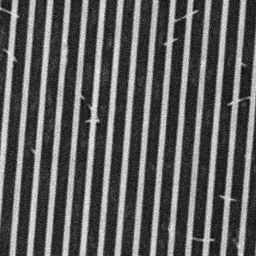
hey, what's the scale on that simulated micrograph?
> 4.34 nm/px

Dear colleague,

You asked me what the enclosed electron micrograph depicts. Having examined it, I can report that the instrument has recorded parallel lines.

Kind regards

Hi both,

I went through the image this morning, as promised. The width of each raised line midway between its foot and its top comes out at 4.61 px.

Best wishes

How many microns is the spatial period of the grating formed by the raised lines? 0.0759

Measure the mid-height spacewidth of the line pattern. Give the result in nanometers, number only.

56.2